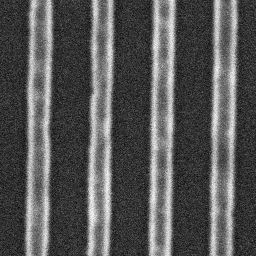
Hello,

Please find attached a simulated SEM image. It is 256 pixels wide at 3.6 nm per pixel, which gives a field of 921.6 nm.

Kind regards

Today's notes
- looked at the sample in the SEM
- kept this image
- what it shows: one or a few lines or trenches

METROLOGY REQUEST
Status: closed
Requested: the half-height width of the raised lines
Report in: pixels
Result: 18.1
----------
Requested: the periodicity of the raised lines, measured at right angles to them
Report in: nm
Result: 222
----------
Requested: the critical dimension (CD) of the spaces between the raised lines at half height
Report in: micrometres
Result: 0.156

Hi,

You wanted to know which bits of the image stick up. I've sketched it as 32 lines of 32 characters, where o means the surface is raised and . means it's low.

....oo......oo......oo.....oo...
....oo......oo.....ooo.....oo...
....oo......oo.....ooo.....oo...
....oo......oo.....ooo.....oo...
....oo......oo.....ooo.....oo...
....oo......oo.....ooo.....oo...
....oo......oo.....ooo.....oo...
....oo......oo.....oo......oo...
....oo......oo.....oo......oo...
....oo......oo.....oo......oo...
....oo......oo.....oo......oo...
....oo......oo.....oo......oo...
....oo......oo.....oo......oo...
....oo......oo.....oo......oo...
....oo......oo.....oo......oo...
....oo......oo.....oo......oo...
....oo......oo.....oo......oo...
....oo......oo.....oo......oo...
....oo.....ooo.....oo......oo...
....oo.....ooo.....oo......oo...
....oo.....oo......oo......oo...
....oo.....ooo.....oo......oo...
....oo.....ooo.....oo......oo...
....oo.....ooo.....oo......oo...
....oo.....ooo.....oo......oo...
....oo.....ooo.....oo......oo...
....oo.....oo......oo......oo...
....oo.....oo......oo......oo...
...ooo.....oo......oo......oo...
...ooo.....oo......oo......oo...
...ooo.....oo......oo......oo...
....oo.....oo......oo......oo...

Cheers